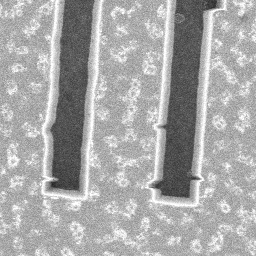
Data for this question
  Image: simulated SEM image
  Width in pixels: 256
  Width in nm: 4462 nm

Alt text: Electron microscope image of one or a few lines or trenches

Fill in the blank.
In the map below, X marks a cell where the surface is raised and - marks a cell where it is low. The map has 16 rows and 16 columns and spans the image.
XXXX--XXXXX--XXX
XXXX--XXXXX--XXX
XXX---XXXXX--XXX
XXX---XXXX---XXX
XXX---XXXX---XXX
XXX---XXXX---XXX
XXX---XXXX---XXX
XXX---XXXX---XXX
XXX--XXXXX--XXXX
XXX--XXXXX--XXXX
XXX--XXXXX--XXXX
XXX--XXXXX--XXXX
XXXXXXXXXX--XXXX
XXXXXXXXXXXXXXXX
XXXXXXXXXXXXXXXX
XXXXXXXXXXXXXXXX